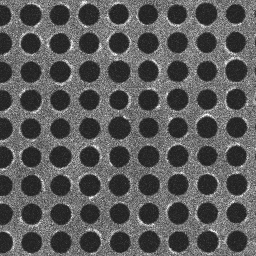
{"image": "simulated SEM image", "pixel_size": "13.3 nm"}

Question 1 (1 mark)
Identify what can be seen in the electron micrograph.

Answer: a regular array of holes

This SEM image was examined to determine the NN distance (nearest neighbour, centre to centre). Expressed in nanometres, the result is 377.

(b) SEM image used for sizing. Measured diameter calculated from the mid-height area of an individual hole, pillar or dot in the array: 285 nm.